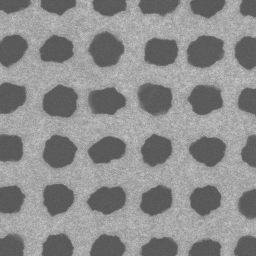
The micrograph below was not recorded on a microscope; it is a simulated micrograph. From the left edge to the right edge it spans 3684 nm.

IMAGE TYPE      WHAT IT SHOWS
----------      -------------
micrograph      a regular array of holes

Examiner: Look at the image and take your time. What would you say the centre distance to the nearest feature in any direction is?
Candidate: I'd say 692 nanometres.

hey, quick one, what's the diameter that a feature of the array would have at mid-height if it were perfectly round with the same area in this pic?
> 0.452 um